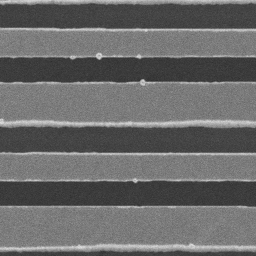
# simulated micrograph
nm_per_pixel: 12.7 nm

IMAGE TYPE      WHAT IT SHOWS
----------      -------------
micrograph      lines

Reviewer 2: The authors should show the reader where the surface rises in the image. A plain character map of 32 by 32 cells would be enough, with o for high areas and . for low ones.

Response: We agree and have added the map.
................................
................................
................................
................................
oooooooooooooooooooooooooooooooo
oooooooooooooooooooooooooooooooo
oooooooooooooooooooooooooooooooo
................................
................................
................................
oooooooooooooooooooooooooooooooo
oooooooooooooooooooooooooooooooo
oooooooooooooooooooooooooooooooo
oooooooooooooooooooooooooooooooo
oooooooooooooooooooooooooooooooo
oooooooooooooooooooooooooooooooo
................................
................................
................................
oooooooooooooooooooooooooooooooo
oooooooooooooooooooooooooooooooo
oooooooooooooooooooooooooooooooo
ooooooooooooooooooo..ooooooo..oo
................................
................................
................................
oooooooooooooooooooooooooooooooo
oooooooooooooooooooooooooooooooo
oooooooooooooooooooooooooooooooo
oooooooooooooooooooooooooooooooo
oooooooooooooooooooooooooooooooo
................................